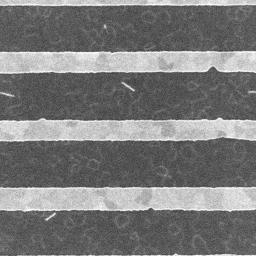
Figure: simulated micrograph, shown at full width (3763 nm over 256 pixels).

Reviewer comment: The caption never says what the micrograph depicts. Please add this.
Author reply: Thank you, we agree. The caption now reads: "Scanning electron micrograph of one or a few lines or trenches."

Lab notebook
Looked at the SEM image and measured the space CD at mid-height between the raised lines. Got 697 nm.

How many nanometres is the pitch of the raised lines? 1010